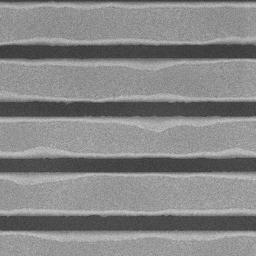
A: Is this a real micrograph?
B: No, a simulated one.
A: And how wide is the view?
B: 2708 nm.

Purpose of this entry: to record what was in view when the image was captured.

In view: lines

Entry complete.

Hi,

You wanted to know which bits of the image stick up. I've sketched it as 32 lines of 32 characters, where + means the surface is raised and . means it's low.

+..+++++++..++++..++++++++++++++
++++++++++++++++++++++++++++++++
++++++++++++++++++++++++++++++++
++++++++++++++++++++++++++++++++
++++++++++++++++++++++++++++++++
+.......+.......................
................................
+++...................++++++++++
++++++++++++++++++++++++++++++++
++++++++++++++++++++++++++++++++
++++++++++++++++++++++++++++++++
++++++++++++++++++++++++++++++++
.....+++++++++++..+..+++++++++++
................................
................................
++++++++++++++++++++++++++++++++
++++++++++++++++++++++++++++++++
++++++++++++++++++++++++++++++++
++++++++++++++++++++++++++++++++
+++++..++++++++++++++++++++++.++
................................
................................
++++++++++++++++++++++++++++++++
++++++++++++++++++++++++++++++++
++++++++++++++++++++++++++++++++
++++++++++++++++++++++++++++++++
++++++++++++++++++++++++++++++++
................................
................................
++++++++++++++++++++++++++++++++
++++++++++++++++++++++++++++++++
++++++++++++++++++++++++++++++++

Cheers